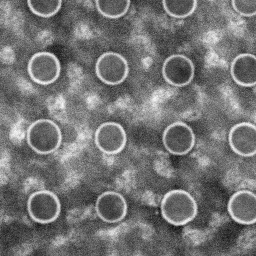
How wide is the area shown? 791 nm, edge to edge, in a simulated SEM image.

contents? a regular array of raised bodies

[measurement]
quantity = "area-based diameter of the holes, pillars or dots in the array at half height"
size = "94.1 nm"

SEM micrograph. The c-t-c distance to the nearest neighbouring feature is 67.4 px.